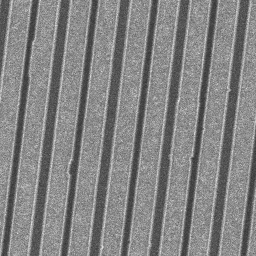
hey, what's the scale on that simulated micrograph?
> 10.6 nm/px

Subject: parallel lines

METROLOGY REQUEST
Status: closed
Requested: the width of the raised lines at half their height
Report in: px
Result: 21.1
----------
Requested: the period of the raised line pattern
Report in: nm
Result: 315